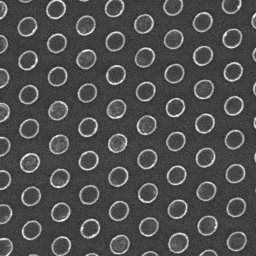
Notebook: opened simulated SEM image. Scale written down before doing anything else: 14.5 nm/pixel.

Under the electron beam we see a regular array of raised bodies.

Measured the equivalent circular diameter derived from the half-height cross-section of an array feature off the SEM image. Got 0.273 microns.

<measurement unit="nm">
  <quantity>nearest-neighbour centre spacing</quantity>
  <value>486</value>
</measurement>